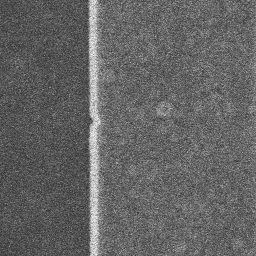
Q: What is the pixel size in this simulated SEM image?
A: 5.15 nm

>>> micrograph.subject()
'one or a few lines or trenches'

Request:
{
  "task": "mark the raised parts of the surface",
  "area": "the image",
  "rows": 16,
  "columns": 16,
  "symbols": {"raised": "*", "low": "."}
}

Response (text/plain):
......**********
......**********
......**********
......**********
......**********
......**********
......**********
......**********
......**********
......**********
......**********
......**********
......**********
......**********
......**********
......**********